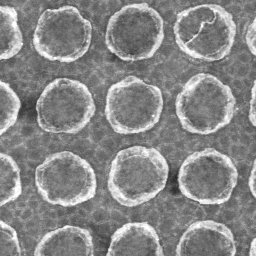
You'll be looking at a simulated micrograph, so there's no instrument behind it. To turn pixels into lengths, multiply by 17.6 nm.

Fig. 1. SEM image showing a regular array of raised bodies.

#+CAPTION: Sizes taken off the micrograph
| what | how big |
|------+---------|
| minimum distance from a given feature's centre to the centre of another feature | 1250 nm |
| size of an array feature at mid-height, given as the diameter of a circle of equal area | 963 nm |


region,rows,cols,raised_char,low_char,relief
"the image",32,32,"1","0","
00000000000000000000000000000000
10000011110000011111000011100000
11000111111000111111001111111000
11000111111001111111001111111000
11001111111001111111001111111001
11000111111000111111000111111001
11000111111000111110000011110000
00000000000000000000000000000000
00000000000000000000000000000000
00000000000000000000000000000000
00000001110000011100000011110000
10000111111000111111000111111000
11000111111100111111001111111000
11000111111001111111001111111001
11000111111001111111001111110001
10000111110000111110000111110000
00000011000000001000000001000000
00000000000000000000000000000000
00000000000000001100000000000000
00000001110000011111000001110000
11000111111000111111100111111000
11001111111100111111100111111100
11000111111100111111100111111101
11000111111100111111000111111001
11000011111000011110000011111000
00000000000000000000000000000000
00000000000000000000000000000000
00000000000000000000000000000000
10000000110000001110000011110000
11000011111000011110000111111000
11000111111000111111000111111000
11000111111101111111001111111001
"